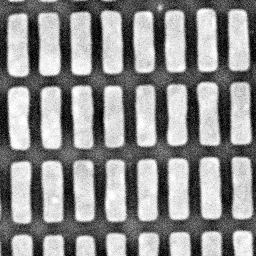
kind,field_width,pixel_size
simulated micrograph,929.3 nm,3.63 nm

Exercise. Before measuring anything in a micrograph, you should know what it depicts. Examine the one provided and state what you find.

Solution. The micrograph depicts groups of lines, slits or small figures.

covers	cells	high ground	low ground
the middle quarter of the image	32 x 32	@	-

--@@@@@---@@@@----@@@@----@@@@--
--@@@@@---@@@@----@@@@----@@@@--
--------------------------------
--------------------------------
--------------------------------
---------------------------@@@--
--@@@@@---@@@@----@@@@----@@@@--
--@@@@@---@@@@----@@@@----@@@@--
--@@@@@---@@@@----@@@@@---@@@@--
--@@@@@---@@@@----@@@@@---@@@@--
--@@@@@---@@@@----@@@@@---@@@@--
--@@@@@---@@@@@---@@@@----@@@@--
--@@@@@---@@@@@---@@@@----@@@@--
---@@@@---@@@@@---@@@@----@@@@--
---@@@@---@@@@@---@@@@----@@@@--
---@@@@---@@@@@---@@@@@---@@@@--
---@@@@---@@@@@---@@@@@---@@@@--
---@@@@---@@@@@---@@@@@---@@@@--
---@@@@---@@@@@---@@@@@---@@@@--
---@@@@----@@@@----@@@@---@@@@--
---@@@@----@@@------------------
--------------------------------
--------------------------------
--------------------------------
---@@@@----@@@@----@@@@---@@@@@-
---@@@@----@@@@----@@@@---@@@@@-
---@@@@----@@@@----@@@@---@@@@@-
---@@@@----@@@@----@@@@---@@@@@-
---@@@@----@@@@----@@@@---@@@@@-
---@@@@----@@@@----@@@@---@@@@@-
---@@@@----@@@@----@@@@---@@@@@-
---@@@@----@@@@----@@@@---@@@@@-